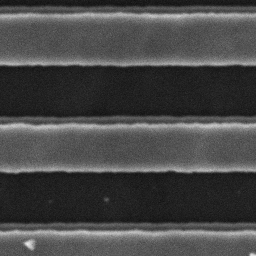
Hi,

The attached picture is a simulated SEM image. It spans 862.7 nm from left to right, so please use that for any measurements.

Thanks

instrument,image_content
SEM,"lines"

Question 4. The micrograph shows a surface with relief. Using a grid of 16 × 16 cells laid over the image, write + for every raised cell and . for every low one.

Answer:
................
++++++++++++++++
++++++++++++++++
++++++++++++++++
................
................
................
................
++++++++++++++++
++++++++++++++++
++++++++++++++++
................
................
................
++++++++++++++++
++++++++++++++++